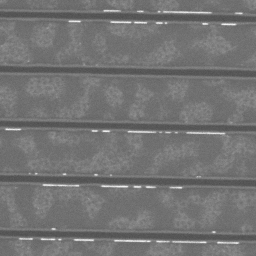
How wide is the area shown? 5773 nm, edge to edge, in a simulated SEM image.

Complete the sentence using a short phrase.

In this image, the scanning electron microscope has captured parallel lines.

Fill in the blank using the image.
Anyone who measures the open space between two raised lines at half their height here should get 1.03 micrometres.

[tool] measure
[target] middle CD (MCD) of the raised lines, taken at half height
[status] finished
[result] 197 nanometres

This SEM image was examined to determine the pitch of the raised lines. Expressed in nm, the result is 1230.